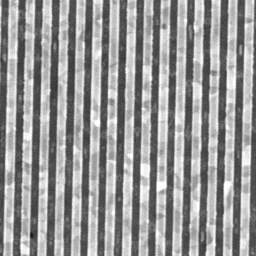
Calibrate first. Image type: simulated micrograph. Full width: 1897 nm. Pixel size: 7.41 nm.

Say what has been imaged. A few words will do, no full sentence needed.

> parallel lines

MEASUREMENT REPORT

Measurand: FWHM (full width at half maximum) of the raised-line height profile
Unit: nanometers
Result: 58.3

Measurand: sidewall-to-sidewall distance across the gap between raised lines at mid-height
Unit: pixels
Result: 8.87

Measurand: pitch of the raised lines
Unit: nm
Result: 125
